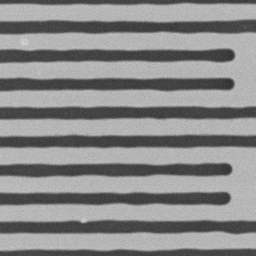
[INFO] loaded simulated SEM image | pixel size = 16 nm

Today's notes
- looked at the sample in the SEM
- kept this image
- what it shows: groups of lines, slits or small figures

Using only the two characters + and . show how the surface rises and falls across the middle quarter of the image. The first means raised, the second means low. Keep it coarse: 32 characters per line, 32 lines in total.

++++++++++++++++++++++++++++++++
++++++++++++++++++++++++++++++++
++++++++++++++++++++++++++++++++
...++++............++...........
................................
................................
................................
++++++++++++++++++++++++++++++++
++++++++++++++++++++++++++++++++
++++++++++++++++++++++++++++++++
+++++++++..++++++++++++++++.....
................................
................................
................................
++++++++++++++++++++++++++++++++
++++++++++++++++++++++++++++++++
++++++++++++++++++++++++++++++++
+++++++++++++++++++++++++++++++.
................................
................................
................................
++++++++++++++++++++++++++++++++
++++++++++++++++++++++++++++++++
++++++++++++++++++++++++++++++++
++++++++++++++++++++++++++++++++
................................
................................
................................
++++++++++++++++++++++++++++++++
++++++++++++++++++++++++++++++++
++++++++++++++++++++++++++++++++
++++++++++++++++++++++++++++++++